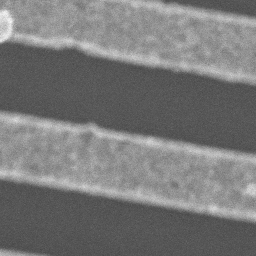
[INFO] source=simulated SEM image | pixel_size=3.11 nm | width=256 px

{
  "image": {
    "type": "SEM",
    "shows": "one or a few lines or trenches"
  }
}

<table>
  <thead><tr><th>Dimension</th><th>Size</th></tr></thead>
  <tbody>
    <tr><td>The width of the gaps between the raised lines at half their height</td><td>252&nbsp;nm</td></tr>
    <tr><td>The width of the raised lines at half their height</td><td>171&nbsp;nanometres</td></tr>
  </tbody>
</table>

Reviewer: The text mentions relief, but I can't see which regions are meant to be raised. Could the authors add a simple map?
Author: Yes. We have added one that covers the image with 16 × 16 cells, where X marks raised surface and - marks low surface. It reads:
XXXXXXXXXX------
XXXXXXXXXXXXXXXX
---XXXXXXXXXXXXX
-------XXXXXXXXX
--------------XX
----------------
----------------
X---------------
XXXXXXX---------
XXXXXXXXXXXXX---
XXXXXXXXXXXXXXXX
----XXXXXXXXXXXX
----------XXXXXX
----------------
----------------
----------------